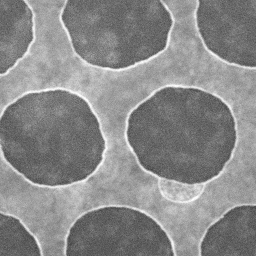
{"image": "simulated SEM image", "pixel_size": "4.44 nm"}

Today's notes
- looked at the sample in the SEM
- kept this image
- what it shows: holes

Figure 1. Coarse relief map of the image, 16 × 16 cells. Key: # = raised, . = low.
..##......##....
..##.......#....
..##......###...
.####.....####..
################
##########..####
#.....###.....##
......##.......#
......##.......#
.......#.......#
#.....###.....##
##..######...###
###########.####
.####....#####..
..##......###...
..##.......##...